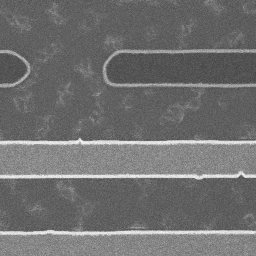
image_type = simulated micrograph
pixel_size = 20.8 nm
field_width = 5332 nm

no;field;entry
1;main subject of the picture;one or a few lines or trenches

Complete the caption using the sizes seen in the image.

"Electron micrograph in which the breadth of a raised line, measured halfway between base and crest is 700 nm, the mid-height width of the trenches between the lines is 1170 nm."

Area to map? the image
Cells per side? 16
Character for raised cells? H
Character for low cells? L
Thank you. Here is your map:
LLLLLLLLLLLLLLLL
LLLLLLLLLLLLLLLL
LLLLLLLLLLLLLLLL
HLLLLLLHHHHHHHHH
HHLLLLLHHHHHHHHH
LLLLLLLLLLLLLLLL
LLLLLLLLLLLLLLLL
LLLLLLLLLLLLLLLL
LLLLLLLLLLLLLLLL
HHHHHHHHHHHHHHHH
HHHHHHHHHHHHHHHH
LLLLLLLLLLLLLLLL
LLLLLLLLLLLLLLLL
LLLLLLLLLLLLLLLL
LLLLLLLLLLLLLLLL
HHHHHHHHHHHHHHHH